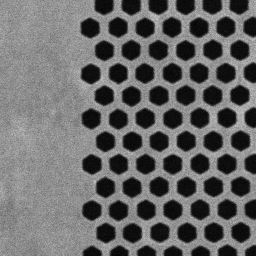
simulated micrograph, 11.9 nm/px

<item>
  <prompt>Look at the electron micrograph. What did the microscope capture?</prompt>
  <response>a regular array of holes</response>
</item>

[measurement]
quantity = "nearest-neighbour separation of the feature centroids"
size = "311 nm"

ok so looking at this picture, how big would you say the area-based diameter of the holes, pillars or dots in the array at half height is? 20 px